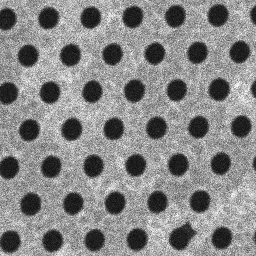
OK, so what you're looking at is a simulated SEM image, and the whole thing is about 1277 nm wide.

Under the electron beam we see a regular array of holes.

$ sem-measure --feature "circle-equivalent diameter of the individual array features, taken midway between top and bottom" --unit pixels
20.1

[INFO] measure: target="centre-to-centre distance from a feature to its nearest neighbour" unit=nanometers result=211